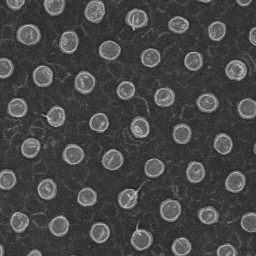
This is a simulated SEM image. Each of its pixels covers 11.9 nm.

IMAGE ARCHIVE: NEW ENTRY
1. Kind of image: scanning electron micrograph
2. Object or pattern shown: a regular array of raised bodies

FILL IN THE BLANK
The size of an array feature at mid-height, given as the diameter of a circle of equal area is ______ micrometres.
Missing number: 0.225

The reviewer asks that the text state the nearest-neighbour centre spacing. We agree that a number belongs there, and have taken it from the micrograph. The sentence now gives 0.472 microns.